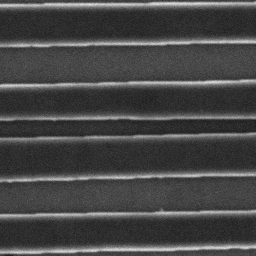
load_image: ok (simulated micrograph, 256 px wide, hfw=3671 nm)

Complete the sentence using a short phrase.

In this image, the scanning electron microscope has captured lines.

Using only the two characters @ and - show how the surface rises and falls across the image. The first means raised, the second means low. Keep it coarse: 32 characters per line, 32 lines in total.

--------@@-@@@@@@@@@@@@@@@@@@@@@
@@@@@@@@@@@@@@@@@@@@@@@@@@@@@@@@
@@@@@@@@@@@@@@@@@@@@@@@@@@@@@@@@
@@@@@@@@@@@@@@@@@@@@@@@@@@@@@@@@
@@@@@@@@@@@@@@@@@@@@@@@@@@@@@@@@
@@@@@@@@@@@@@@@@@@@@------------
--------------------------------
--------------------------------
--------------------------------
--------------------------------
-------------@@@@@@@@@@@@@@@@@@@
@@@@@@@@@@@@@@@@@@@@@@@@@@@@@@@@
@@@@@@@@@@@@@@@@@@@@@@@@@@@@@@@@
@@@@@@@@@@@@@@@@@@@@@@@@@@@@@@@@
@@@@@@@@@@@@@@@@@@@@@@@@@@@@@@@@
--------------------------------
--------------------------------
@@@@@@@@@@@@@@@@@@@@@@@@@@@@@@@@
@@@@@@@@@@@@@@@@@@@@@@@@@@@@@@@@
@@@@@@@@@@@@@@@@@@@@@@@@@@@@@@@@
@@@@@@@@@@@@@@@@@@@@@@@@@@@@@@@@
@@@@@@@@@@@@@@@@@@@@@@@@@@@@@@@@
@@@-----------------------------
--------------------------------
--------------------------------
--------------------------------
--------------------------@@@@@@
@@@@@@@@@@@@@@@@@@@@@@@@@@@@@@@@
@@@@@@@@@@@@@@@@@@@@@@@@@@@@@@@@
@@@@@@@@@@@@@@@@@@@@@@@@@@@@@@@@
@@@@@@@@@@@@@@@@@@@@@@@@@@@@@@@@
@@@@@---------------------------